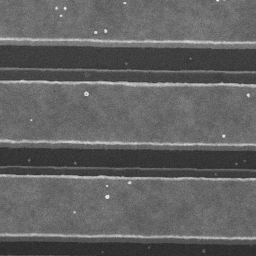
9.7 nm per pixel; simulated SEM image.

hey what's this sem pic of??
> lines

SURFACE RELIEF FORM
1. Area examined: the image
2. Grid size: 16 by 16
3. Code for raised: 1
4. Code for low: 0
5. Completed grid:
1111111111111111
1111111111111111
1111111111111111
0000000000000000
0000000000000000
1111111111111111
1111111111111111
1111111111111111
1111111111111111
0000000000000000
0000000000000000
1111111111111111
1111111111111111
1111111111111111
1111111111111111
0000000000000000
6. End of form